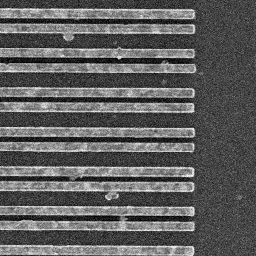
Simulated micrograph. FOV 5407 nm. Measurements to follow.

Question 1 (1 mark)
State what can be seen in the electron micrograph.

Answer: parallel lines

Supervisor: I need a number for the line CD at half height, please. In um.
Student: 0.177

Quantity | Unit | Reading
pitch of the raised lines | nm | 416